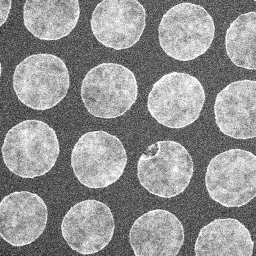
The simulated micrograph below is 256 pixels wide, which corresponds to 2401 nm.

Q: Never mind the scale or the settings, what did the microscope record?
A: a regular array of raised bodies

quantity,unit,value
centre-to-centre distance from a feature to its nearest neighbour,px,68.2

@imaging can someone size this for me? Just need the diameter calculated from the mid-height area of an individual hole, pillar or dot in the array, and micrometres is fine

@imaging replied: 0.517